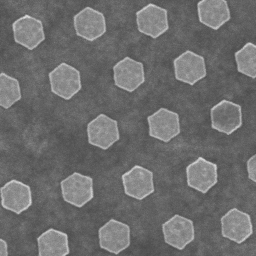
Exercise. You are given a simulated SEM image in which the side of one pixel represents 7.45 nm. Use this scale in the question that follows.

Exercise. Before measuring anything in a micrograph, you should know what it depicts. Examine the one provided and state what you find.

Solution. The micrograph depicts a regular array of raised bodies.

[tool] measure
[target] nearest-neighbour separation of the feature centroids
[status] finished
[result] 452 nm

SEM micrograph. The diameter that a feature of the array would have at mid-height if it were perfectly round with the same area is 230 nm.